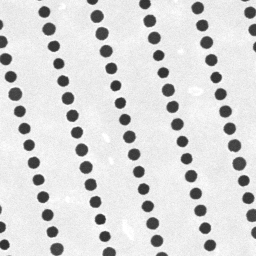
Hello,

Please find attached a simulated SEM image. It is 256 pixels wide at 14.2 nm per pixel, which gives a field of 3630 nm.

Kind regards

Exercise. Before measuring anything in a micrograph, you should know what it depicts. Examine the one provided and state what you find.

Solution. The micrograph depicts a regular array of holes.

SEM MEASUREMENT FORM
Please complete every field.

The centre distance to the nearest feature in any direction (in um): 0.252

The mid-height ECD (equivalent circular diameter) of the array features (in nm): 176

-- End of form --